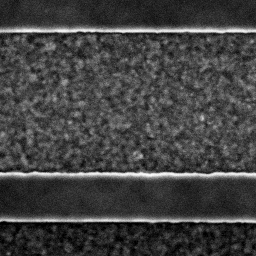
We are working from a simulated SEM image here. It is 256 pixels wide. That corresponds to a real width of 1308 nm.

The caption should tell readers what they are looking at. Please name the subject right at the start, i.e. lines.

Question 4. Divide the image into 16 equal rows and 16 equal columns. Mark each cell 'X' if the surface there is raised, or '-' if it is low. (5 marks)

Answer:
XXXXXXXXXXXXXXXX
XXXXXXXXXXXXXXXX
----------------
----------------
----------------
----------------
----------------
----------------
----------------
----------------
----------------
XXXXXXXXXXXXXXXX
XXXXXXXXXXXXXXXX
XXXXXXXXXXXXXXXX
----------------
----------------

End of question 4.